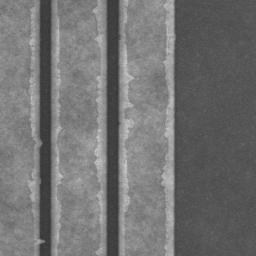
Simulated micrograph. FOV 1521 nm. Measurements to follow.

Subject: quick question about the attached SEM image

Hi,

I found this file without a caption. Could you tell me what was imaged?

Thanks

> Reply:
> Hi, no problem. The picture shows one or a few lines or trenches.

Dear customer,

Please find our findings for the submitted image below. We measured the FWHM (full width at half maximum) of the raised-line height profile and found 0.295 um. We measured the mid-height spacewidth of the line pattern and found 107 nm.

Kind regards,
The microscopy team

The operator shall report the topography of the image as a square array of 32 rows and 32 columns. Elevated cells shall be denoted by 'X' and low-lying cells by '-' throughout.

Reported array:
XXXX---XXXXXX--XXXXXX-----------
XXXX---XXXXXX--XXXXXX-----------
XXXX---XXXXXX--XXXXXX-----------
XXXX---XXXXXX--XXXXXX-----------
XXXX---XXXXXX--XXXXXXX----------
XXXX---XXXXXX--XXXXXX-----------
XXXX---XXXXXX--XXXXXX-----------
XXXX---XXXXXX--XXXXXX-----------
XXXX---XXXXXX--XXXXXX-----------
XXXX---XXXXXX--XXXXXX-----------
XXXX---XXXXXX--XXXXXX-----------
XXXX---XXXXXX--XXXXXX-----------
XXXX---XXXXXX--XXXXXX-----------
XXXX---XXXXXX--XXXXXX-----------
XXXX---XXXXXX--XXXXXX-----------
XXXX---XXXXXX--XXXXXX-----------
XXXX---XXXXXX--XXXXXX-----------
XXXXX--XXXXXX--XXXXXX-----------
XXXXX--XXXXXX--XXXXXX-----------
XXXX---XXXXXX--XXXXXX-----------
XXXX---XXXXXX--XXXXXX-----------
XXXX---XXXXXX--XXXXXX-----------
XXXXX--XXXXXX--XXXXXX-----------
XXXXX--XXXXXX--XXXXXX-----------
XXXX---XXXXXX--XXXXXX-----------
XXXX---XXXXXX--XXXXXX-----------
XXXX---XXXXXX--XXXXXX-----------
XXXX---XXXXXX--XXXXXX-----------
XXXX---XXXXXX--XXXXXX-----------
XXXXX--XXXXXX--XXXXXX-----------
XXXXX--XXXXXX--XXXXXX-----------
XXXX---XXXXXX--XXXXXX-----------